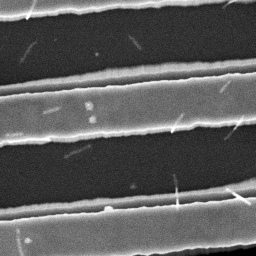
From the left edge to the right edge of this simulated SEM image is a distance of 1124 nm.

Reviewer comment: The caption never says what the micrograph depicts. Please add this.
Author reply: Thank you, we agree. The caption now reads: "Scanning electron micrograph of lines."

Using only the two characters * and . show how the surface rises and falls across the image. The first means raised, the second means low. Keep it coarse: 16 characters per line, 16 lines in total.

******..........
................
................
................
................
.....***********
****************
****************
*****...........
................
................
................
..............**
...*************
****************
*************...